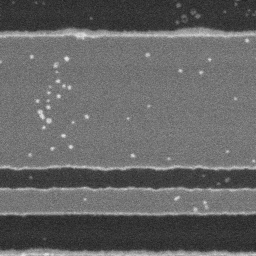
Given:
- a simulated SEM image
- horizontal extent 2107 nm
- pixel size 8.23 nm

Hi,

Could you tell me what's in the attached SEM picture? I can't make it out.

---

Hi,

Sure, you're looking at lines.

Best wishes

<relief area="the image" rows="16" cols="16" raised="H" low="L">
LLLLLLLLLLLLLLLL
LLLLLLLLLLLLLLLL
HHHHHHHHHHHHHHHH
HHHHHHHHHHHHHHHH
HHHHHHHHHHHHHHHH
HHHHHHHHHHHHHHHH
HHHHHHHHHHHHHHHH
HHHHHHHHHHHHHHHH
HHHHHHHHHHHHHHHH
HHHHHHHHHHHHHHHH
HHHHHHHHHHHHHHHH
HHHHHHHHHHHHHHHH
HHHHHHHHHHHHHHHH
LLLLLLLLLLLLLLLL
LLLLLLLLLLLLLLLL
LLLLLLLLLLLLLLLL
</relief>